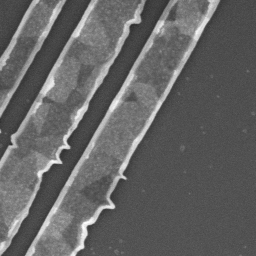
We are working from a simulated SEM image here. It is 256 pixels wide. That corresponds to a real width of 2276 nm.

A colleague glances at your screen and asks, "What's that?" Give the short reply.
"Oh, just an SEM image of one or a few lines or trenches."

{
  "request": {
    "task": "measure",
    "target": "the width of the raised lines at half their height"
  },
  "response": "362 nm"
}